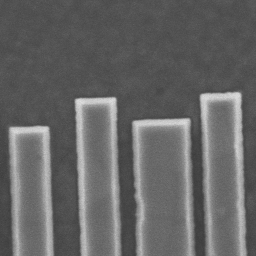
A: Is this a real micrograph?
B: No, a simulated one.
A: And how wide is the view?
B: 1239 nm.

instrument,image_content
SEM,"one or a few lines or trenches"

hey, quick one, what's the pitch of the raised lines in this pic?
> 310 nm